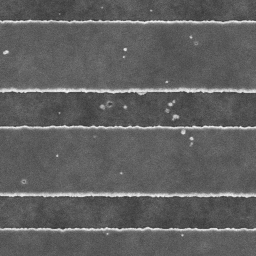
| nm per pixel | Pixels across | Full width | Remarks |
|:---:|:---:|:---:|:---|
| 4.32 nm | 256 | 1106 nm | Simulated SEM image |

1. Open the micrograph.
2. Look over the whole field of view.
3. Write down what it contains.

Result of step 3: lines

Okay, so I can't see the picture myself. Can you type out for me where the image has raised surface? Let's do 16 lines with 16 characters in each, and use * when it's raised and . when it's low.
................
****************
****************
****************
****************
****************
................
................
****************
****************
****************
****************
................
................
****************
****************